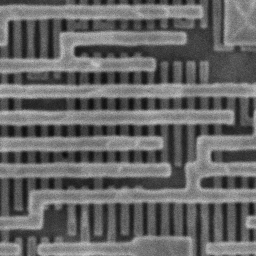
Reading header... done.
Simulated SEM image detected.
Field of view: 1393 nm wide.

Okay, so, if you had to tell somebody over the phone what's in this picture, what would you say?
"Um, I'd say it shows wiring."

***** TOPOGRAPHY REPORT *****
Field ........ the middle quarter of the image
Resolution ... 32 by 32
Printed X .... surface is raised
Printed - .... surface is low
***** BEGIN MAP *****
XXXXXXXXXXXXXXXXXXXXXXX---------
XXXXXXXXXXXXXXXXXXXXXXX---------
--------------------------------
--------------------------------
--------------------------------
----XXXXXXXXXXXXXXXX-XXXXXXXXXXX
XXXXXXXXXXXXXXXXXXXXXXXXXXXXXXXX
XXXXXXXXXXXXXXXXXXXXXXXXXXXXXXXX
--------------------------------
--------------------------------
--------------------------------
--------------------------------
XXXXXXXXXXXXXXXXXXXXXXXXXXXXXXXX
XXXXXXXXXXXXXXXXXXXXXXXXXXXXXXXX
XXXXXXXXXXXXXXXXXXXXXXXXXXXXXXXX
--------------------------------
--------------------------------
--------------------------------
----XXXXXXXXXXXXXXXXXXXX--------
XXXXXXXXXXXXXXXXXXXXXXXXX-------
XXXXXXXXXXXXXXXXXXXXXXXXX-------
XXXXX-XXXXXXXXX-----------------
--------------------------------
--------------------------------
--------------------------------
XXXXXXXXXXXXXXXXXXXXXXXXXXX----X
XXXXXXXXXXXXXXXXXXXXXXXXXXX----X
XXXXXXXXXXXXXXXXXXXXXXXXXXX----X
-------------------------------X
-------------------------------X
-------------------------------X
---------------XXXXX-----XXXXXXX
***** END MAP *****